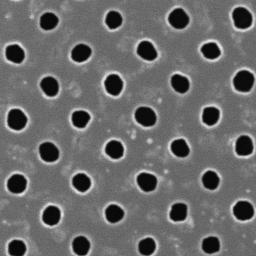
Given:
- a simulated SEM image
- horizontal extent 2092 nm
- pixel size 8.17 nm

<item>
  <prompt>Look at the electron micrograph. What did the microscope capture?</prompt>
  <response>a regular array of holes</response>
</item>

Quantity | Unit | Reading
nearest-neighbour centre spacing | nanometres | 367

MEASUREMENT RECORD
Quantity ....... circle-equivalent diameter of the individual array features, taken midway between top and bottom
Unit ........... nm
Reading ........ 154